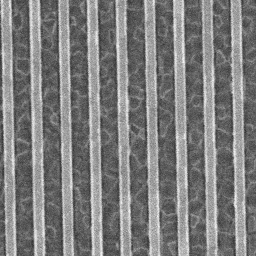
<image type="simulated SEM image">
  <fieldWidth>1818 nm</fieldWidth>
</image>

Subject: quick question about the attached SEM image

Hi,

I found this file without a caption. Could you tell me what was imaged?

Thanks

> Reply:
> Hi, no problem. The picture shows parallel lines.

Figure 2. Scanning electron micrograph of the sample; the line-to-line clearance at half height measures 0.138 micrometres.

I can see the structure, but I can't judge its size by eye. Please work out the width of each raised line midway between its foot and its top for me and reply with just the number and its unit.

68.3 nm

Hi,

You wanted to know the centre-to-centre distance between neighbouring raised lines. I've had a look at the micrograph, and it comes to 0.204 um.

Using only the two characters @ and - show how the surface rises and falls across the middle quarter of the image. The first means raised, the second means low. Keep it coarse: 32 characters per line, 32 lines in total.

@-----@@-----@@@-----@@-----@@--
@-----@@------@@-----@@-----@@--
@-----@@------@@-----@@-----@@--
@-----@@------@@-----@@-----@@--
@-----@@@-----@@-----@@-----@@--
@-----@@@-----@@-----@@-----@@--
@-----@@@-----@@-----@@-----@@--
@-----@@@-----@@-----@@-----@@--
@-----@@@-----@@-----@@-----@@--
@-----@@@-----@@-----@@-----@@--
@-----@@@-----@@-----@@-----@@--
@-----@@@-----@@-----@@-----@@--
@-----@@@-----@@-----@@-----@@--
@------@@-----@@-----@@-----@@--
@@-----@@-----@@-----@@-----@@--
@@-----@@-----@@-----@@-----@@--
@@-----@@-----@@-----@@-----@@--
@@-----@@-----@@-----@@-----@@--
@@-----@@-----@@-----@@-----@@--
@@-----@@-----@@-----@@-----@@--
@@-----@@-----@@-----@@-----@@--
@@-----@@-----@@-----@@-----@@--
@@-----@@-----@@-----@@-----@@--
@@-----@@-----@@-----@@-----@@--
@@-----@@-----@@-----@@-----@@--
@@-----@@-----@@-----@@-----@@--
@@-----@@-----@@-----@@-----@@@-
@@-----@@-----@@-----@@-----@@@-
@@-----@@-----@@-----@@@----@@@-
@@-----@@-----@@-----@@@----@@@-
@@-----@@-----@@-----@@@----@@@-
@@-----@@-----@@-----@@@----@@@-